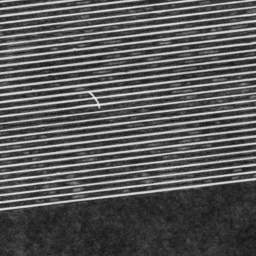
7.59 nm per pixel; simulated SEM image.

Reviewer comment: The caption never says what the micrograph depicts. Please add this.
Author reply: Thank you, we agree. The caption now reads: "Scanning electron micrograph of parallel lines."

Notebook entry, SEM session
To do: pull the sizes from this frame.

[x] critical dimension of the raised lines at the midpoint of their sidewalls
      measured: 14.1 nm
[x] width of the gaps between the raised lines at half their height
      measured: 39.5 nm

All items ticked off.